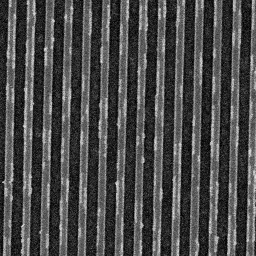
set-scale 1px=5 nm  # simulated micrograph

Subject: parallel lines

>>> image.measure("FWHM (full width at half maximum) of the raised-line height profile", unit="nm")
38.7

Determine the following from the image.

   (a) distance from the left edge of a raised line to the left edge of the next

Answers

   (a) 93.6 nm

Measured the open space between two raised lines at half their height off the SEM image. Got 55.6 nanometres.